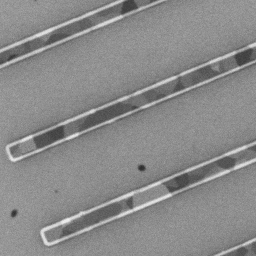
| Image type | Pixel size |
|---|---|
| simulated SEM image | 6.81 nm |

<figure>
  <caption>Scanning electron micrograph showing one or a few lines or trenches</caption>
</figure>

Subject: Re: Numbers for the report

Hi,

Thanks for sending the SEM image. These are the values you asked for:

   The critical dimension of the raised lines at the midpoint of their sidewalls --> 111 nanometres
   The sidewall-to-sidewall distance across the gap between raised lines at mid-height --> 515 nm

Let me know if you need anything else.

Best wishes